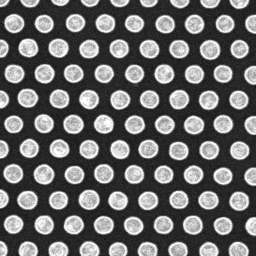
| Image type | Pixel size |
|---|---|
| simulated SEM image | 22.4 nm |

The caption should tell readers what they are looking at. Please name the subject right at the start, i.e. a regular array of raised bodies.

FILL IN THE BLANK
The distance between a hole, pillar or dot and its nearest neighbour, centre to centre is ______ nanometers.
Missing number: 642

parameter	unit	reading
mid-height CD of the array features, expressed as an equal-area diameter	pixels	18.4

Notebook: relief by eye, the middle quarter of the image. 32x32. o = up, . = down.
.ooo.....oo......oo.....oo......
oooo....oooo....ooo....oooo....o
ooooo...oooo...ooooo...oooo...oo
.oooo...oooo....ooo....oooo...oo
..o......oo......o......oo......
................................
................................
o...oooo....oooo....ooo....oooo.
o...oooo....oooo...ooooo...oooo.
o...oooo....oooo...oooo....oooo.
.....ooo....oooo....ooo....ooo..
................................
................................
oooo....oooo....ooo.....oo.....o
ooooo...oooo....oooo...oooo...oo
ooooo...oooo...ooooo...ooooo..oo
oooo....oooo....oooo...oooo....o
................................
................................
.....ooo.....oo.....oo..........
o...oooo....oooo...oooo....oooo.
o...ooooo...oooo...oooo....oooo.
o...oooo....oooo...oooo....oooo.
.....oo......oo............ooo..
................................
.........oo.....................
.ooo....oooo...ooooo...oooo....o
ooooo...oooo...ooooo...oooo...oo
ooooo...oooo...ooooo...oooo...oo
..oo.....oo.....ooo.....oo.....o
................................
................................